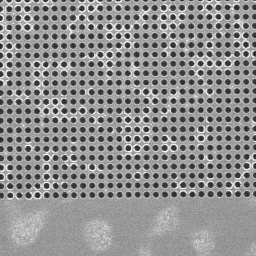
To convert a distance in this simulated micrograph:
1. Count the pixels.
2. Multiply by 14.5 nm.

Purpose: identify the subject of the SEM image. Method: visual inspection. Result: a regular array of holes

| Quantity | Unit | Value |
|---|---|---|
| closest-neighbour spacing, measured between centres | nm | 128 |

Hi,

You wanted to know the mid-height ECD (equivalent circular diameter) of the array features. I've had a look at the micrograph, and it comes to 94 nanometers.